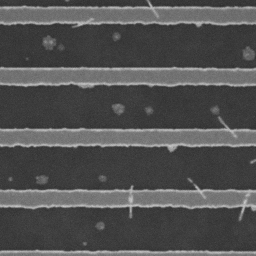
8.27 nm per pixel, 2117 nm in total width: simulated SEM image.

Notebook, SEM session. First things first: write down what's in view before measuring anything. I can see lines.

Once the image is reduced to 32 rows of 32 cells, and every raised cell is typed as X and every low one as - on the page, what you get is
--------------------------------
XXXXXXXXXXXXXXXXXXXXXXXXXXXXXXXX
XXXXXXXXXXXXXXXXXXXXXXXXXXXXXXXX
--------------------------------
--------------------------------
--------------------------------
--------------------------------
--------------------------------
X---------X----------X----------
XXXXXXXXXXXXXXXXXXXXXXXXXXXXXXXX
XXXXXXXXXXXXXXXXXXXXXXXXXXXXXXXX
--------------------------------
--------------------------------
--------------------------------
--------------------------------
--------------------------------
XXXXXXXXXXXXXXXXXXXXXXXXXXXXXXXX
XXXXXXXXXXXXXXXXXXXXXXXXXXXXXXXX
--------------------------------
--------------------------------
--------------------------------
--------------------------------
--------------------------------
--------------------------------
XXXXXXXXXXXXXXXXXXXXXXXXXXXXXXXX
XXXXXXXXXXXXXXXXXXXXXXXXXXXXXXXX
--------------------------------
--------------------------------
--------------------------------
--------------------------------
--------------------------------
XXXXXXXX-XXXX-XXXXX--XXXXX---X--